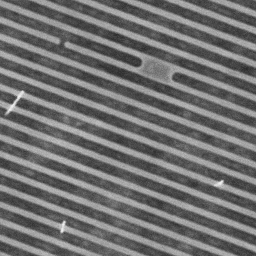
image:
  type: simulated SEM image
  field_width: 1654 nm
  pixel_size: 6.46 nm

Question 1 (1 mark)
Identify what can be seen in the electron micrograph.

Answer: parallel lines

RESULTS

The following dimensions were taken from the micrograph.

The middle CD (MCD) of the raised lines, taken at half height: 5.51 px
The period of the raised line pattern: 102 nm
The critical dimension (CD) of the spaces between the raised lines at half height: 65.9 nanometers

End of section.